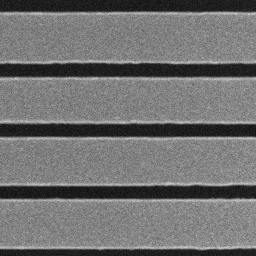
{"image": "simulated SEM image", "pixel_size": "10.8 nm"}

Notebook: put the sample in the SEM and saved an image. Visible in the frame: lines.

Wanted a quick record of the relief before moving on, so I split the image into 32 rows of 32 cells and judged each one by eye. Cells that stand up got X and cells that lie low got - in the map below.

--------------------------------
--------------------------------
XXXXXXXXXXXXXXXXXXXXXXXXXXXXXXXX
XXXXXXXXXXXXXXXXXXXXXXXXXXXXXXXX
XXXXXXXXXXXXXXXXXXXXXXXXXXXXXXXX
XXXXXXXXXXXXXXXXXXXXXXXXXXXXXXXX
XXXXXXXXXXXXXXXXXXXXXXXXXXXXXXXX
XXXXXXXXXXXXXXXXXXXXXXXXXXXXXXXX
--------------------------------
--------------------------------
XXXXXXXXXXXXXXXXXXXXXXXXXXXXXXXX
XXXXXXXXXXXXXXXXXXXXXXXXXXXXXXXX
XXXXXXXXXXXXXXXXXXXXXXXXXXXXXXXX
XXXXXXXXXXXXXXXXXXXXXXXXXXXXXXXX
XXXXXXXXXXXXXXXXXXXXXXXXXXXXXXXX
--------------------------------
--------------------------------
XXXXXXXXXXXXXXXXXXXXXXXXXXXXXXXX
XXXXXXXXXXXXXXXXXXXXXXXXXXXXXXXX
XXXXXXXXXXXXXXXXXXXXXXXXXXXXXXXX
XXXXXXXXXXXXXXXXXXXXXXXXXXXXXXXX
XXXXXXXXXXXXXXXXXXXXXXXXXXXXXXXX
XXXXXXXXXXXXXXXXXXXXXXXXXXXXXXXX
--------------------------------
--------------------------------
XXXXXXXXXXXXXXXXXXXXXXXXXXXXXXXX
XXXXXXXXXXXXXXXXXXXXXXXXXXXXXXXX
XXXXXXXXXXXXXXXXXXXXXXXXXXXXXXXX
XXXXXXXXXXXXXXXXXXXXXXXXXXXXXXXX
XXXXXXXXXXXXXXXXXXXXXXXXXXXXXXXX
XXXXXXXXXXXXXXXXXXXXXXXXXXXXXXXX
--------------------------------